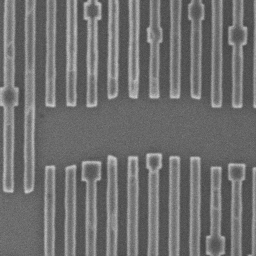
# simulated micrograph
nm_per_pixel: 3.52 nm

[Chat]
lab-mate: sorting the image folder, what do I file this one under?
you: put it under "wiring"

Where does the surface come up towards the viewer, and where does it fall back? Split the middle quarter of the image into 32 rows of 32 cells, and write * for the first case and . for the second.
.**...**...**...**....**...**...
.**...**...**...***...**...**...
.**...**...**...***...*....**...
.**...**...**...**....*....**...
.**...**...**...**....*....**...
.**...**...**...**....*....**...
.**...**...**...**....**...**...
.**...**...**....*....**...**...
.**...**........................
.**...**........................
......**........................
................................
................................
................................
................................
................................
................................
................................
................................
................................
................................
................................
................................
...........**...**...***...**...
...........**...**...***...**...
..*..****..**...**...***...**...
.**..****..**...**...***...**...
.**..****..**...**...**....**...
.**..****..**...**...**....**...
.**..***...**...**...**....**...
.**...**...**...**...**....**...
.**...**...**...**...**....**...